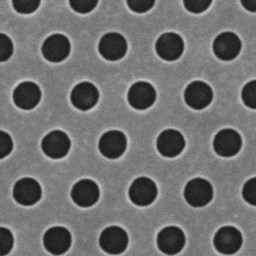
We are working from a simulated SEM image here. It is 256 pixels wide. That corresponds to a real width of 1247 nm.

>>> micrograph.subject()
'a regular array of holes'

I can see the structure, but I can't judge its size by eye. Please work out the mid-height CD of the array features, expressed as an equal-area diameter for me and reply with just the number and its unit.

149 nm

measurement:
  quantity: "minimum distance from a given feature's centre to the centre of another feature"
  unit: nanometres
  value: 270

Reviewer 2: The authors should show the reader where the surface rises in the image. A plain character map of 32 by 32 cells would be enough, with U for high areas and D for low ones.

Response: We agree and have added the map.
UDDDDUUUUDDDUUUUDDDUUUUDDDUUUUDD
UUDDUUUUUDDUUUUUUDUUUUUUDDUUUUUD
UUUUUUUUUUUUUUUUUUUUUUUUUUUUUUUU
UUUUUUUUUUUUUUUUUUUUUUUUUUUUUUUU
DUUUUUDDUUUUUDDUUUUUDDDUUUUDDDUU
DDUUUDDDDUUUDDDDUUUDDDDUUUUDDDUU
DDUUUDDDDUUUDDDDUUUDDDDUUUUDDDUU
DUUUUUDDUUUUUDDUUUUUDDUUUUUUDUUU
UUUUUUUUUUUUUUUUUUUUUUUUUUUUUUUU
UUUUUUUUUUUUUUUUUUUUUUUUUUUUUUUU
UUDDDUUUUDDDUUUUUDDUUUUUDDUUUUUD
UUDDDUUUUDDDUUUUDDDDUUUDDDDUUUDD
UUDDDUUUUDDDUUUUDDDDUUUDDDDUUUDD
UUDDUUUUUDDDUUUUUDDUUUUUDDUUUUUD
UUUUUUUUUUUUUUUUUUUUUUUUUUUUUUUU
UUUUUUUUUUUUUUUUUUUUUUUUUUUUUUUU
DUUUUUDDUUUUUDDUUUUUDDDUUUUDDDUU
DDUUUDDDDUUUDDDDUUUDDDDUUUUDDDUU
DDUUUDDDDUUUDDDDUUUUDDDUUUUDDDUU
DUUUUUDDUUUUUDDUUUUUDDUUUUUDDUUU
UUUUUUUUUUUUUUUUUUUUUUUUUUUUUUUU
UUUUUUUUUUUUUUUUUUUUUUUUUUUUUUUU
UUDDDUUUUUDDUUUUUDDUUUUUDDUUUUUD
UUDDDUUUUDDDUUUUDDDDUUUDDDDUUUDD
UUDDDUUUUDDDDUUUDDDDUUUDDDDUUUDD
UUDDUUUUUDDDUUUUUDDUUUUUDDUUUUUD
UUUUUUUUUUUUUUUUUUUUUUUUUUUUUUUU
UUUUUUUUUUUUUUUUUUUUUUUUUUUUUUUU
DUUUUUDDUUUUUDDUUUUUDDDUUUUDDDUU
DDUUUDDDDUUUDDDDUUUUDDDUUUUDDDUU
DDUUUDDDDUUUDDDDUUUUDDDUUUUDDDUU
DUUUUUDDUUUUUDDUUUUUDDDUUUUDDDUU